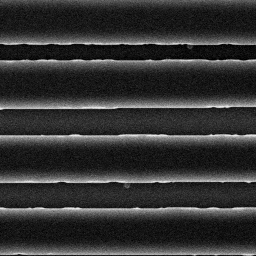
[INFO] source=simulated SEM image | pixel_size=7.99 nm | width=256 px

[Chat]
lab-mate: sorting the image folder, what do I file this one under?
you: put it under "lines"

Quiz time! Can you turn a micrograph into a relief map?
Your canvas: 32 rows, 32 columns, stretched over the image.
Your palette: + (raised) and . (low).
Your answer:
++++++++++++++++++++++++++++++++
++++++++++++++++++++++++++++++++
++++++++++++++++++++++++++++++++
++++++++++++++++++++++++++++++++
++++++++++++++++++++++++++++++++
++.+++.++.+++++.++.+++++++++.+++
................................
................................
++++++++++++++++++++++++++++++++
++++++++++++++++++++++++++++++++
++++++++++++++++++++++++++++++++
++++++++++++++++++++++++++++++++
++++++++++++++++++++++++++++++++
+++++++++++++++.................
................................
................................
................................
++++++++++++++++++++++++++++++++
++++++++++++++++++++++++++++++++
++++++++++++++++++++++++++++++++
++++++++++++++++++++++++++++++++
++++++++++++++++++++++++++++++++
++++++++++++++++++++++++++++++++
................................
................................
................................
++++++++++++++++++++++++++++++++
++++++++++++++++++++++++++++++++
++++++++++++++++++++++++++++++++
++++++++++++++++++++++++++++++++
++++++++++++++++++++++++++++++++
++++++++++++++++++++++++++++++++